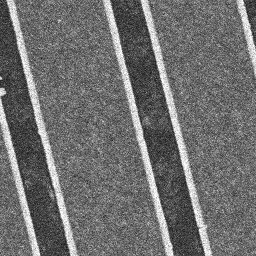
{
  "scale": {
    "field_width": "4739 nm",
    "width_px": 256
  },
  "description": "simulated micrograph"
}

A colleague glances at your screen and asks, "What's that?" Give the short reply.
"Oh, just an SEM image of one or a few lines or trenches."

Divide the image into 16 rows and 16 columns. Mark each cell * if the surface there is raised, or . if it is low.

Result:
.******..******.
.******..******.
.******...******
.*******..******
..******..******
..******..******
..******...*****
..*******..*****
...******..*****
*..******..*****
*..******...****
*..*******..****
*...******..****
**..******..****
**..******...***
**..*******..***